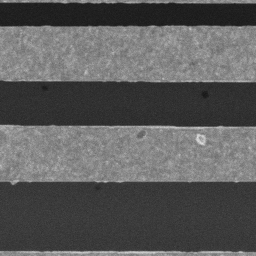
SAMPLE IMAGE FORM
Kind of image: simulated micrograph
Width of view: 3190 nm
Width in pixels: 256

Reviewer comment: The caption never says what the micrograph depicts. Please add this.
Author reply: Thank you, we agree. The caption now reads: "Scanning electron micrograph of lines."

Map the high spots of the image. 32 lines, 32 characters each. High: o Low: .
................................
................................
................................
oooooooooooooooooooooooooooooooo
oooooooooooooooooooooooooooooooo
oooooooooooooooooooooooooooooooo
oooooooooooooooooooooooooooooooo
oooooooooooooooooooooooooooooooo
oooooooooooooooooooooooooooooooo
oooooooooooooooooooooooooooooooo
................................
................................
................................
................................
................................
................................
oooooooooooooooooooooooooooooooo
oooooooooooooooooooooooooooooooo
oooooooooooooooooooooooooooooooo
oooooooooooooooooooooooooooooooo
oooooooooooooooooooooooooooooooo
oooooooooooooooooooooooooooooooo
oooooooooooooooooooooooooooooooo
................................
................................
................................
................................
................................
................................
................................
................................
ooooooooooooooooooooooo..oooooo.